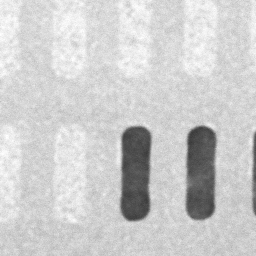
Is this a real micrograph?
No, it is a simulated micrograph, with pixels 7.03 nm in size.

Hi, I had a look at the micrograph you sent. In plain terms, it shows holes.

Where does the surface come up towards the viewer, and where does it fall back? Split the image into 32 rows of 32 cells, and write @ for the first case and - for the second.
@@@@@@@@@@@@@@@@@@@@@@@@@@@@@@@@
@@@@@@@@@@@@@@@@@@@@@@@@@@@@@@@@
@@@@@@@@@@@@@@@@@@@@@@@@@@@@@@@@
@@@@@@@@@@@@@@@@@@@@@@@@@@@@@@@@
@@@@@@@@@@@@@@@@@@@@@@@@@@@@@@@@
@@@@@@@@@@@@@@@@@@@@@@@@@@@@@@@@
@@@@@@@@@@@@@@@@@@@@@@@@@@@@@@@@
@@@@@@@@@@@@@@@@@@@@@@@@@@@@@@@@
@@@@@@@@@@@@@@@@@@@@@@@@@@@@@@@@
@@@@@@@@@@@@@@@@@@@@@@@@@@@@@@@@
@@@@@@@@@@@@@@@@@@@@@@@@@@@@@@@@
@@@@@@@@@@@@@@@@@@@@@@@@@@@@@@@@
@@@@@@@@@@@@@@@@@@@@@@@@@@@@@@@@
@@@@@@@@@@@@@@@@@@@@@@@@@@@@@@@@
@@@@@@@@@@@@@@@@@@@@@@@@@@@@@@@@
@@@@@@@@@@@@@@@@@@@@@@@@@@@@@@@@
@@@@@@@@@@@@@@@----@@@@@---@@@@@
@@@@@@@@@@@@@@@----@@@@----@@@@@
@@@@@@@@@@@@@@@----@@@@----@@@@@
@@@@@@@@@@@@@@@----@@@@----@@@@@
@@@@@@@@@@@@@@@----@@@@----@@@@@
@@@@@@@@@@@@@@@----@@@@----@@@@@
@@@@@@@@@@@@@@@----@@@@----@@@@@
@@@@@@@@@@@@@@@----@@@@----@@@@-
@@@@@@@@@@@@@@@----@@@@----@@@@-
@@@@@@@@@@@@@@@----@@@@----@@@@-
@@@@@@@@@@@@@@@----@@@@----@@@@@
@@@@@@@@@@@@@@@@--@@@@@@--@@@@@@
@@@@@@@@@@@@@@@@@@@@@@@@@@@@@@@@
@@@@@@@@@@@@@@@@@@@@@@@@@@@@@@@@
@@@@@@@@@@@@@@@@@@@@@@@@@@@@@@@@
@@@@@@@@@@@@@@@@@@@@@@@@@@@@@@@@